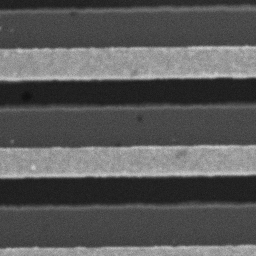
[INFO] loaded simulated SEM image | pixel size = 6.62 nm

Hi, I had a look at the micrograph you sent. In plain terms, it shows lines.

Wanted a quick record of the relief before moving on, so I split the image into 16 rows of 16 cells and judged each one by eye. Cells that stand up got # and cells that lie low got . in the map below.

................
################
################
################
################
................
................
################
################
################
################
................
................
################
################
################